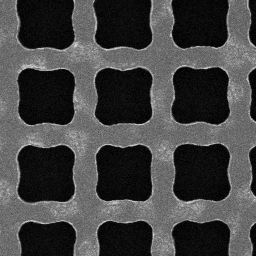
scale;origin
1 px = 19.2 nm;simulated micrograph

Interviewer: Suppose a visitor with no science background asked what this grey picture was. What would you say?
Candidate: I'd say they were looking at holes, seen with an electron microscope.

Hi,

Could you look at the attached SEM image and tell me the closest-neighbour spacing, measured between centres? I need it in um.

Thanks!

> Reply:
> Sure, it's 1.48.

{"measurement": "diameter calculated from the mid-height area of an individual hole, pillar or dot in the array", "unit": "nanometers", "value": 1190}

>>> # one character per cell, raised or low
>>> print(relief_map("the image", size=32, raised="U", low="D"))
UUDDDDDDDUUUDDDDDDDUUDDDDDDDDUUD
UUDDDDDDDUUUDDDDDDDUUUDDDDDDDUUD
UUDDDDDDDUUUDDDDDDDUUUDDDDDDUUUD
UUDDDDDDDUUUDDDDDDDUUUDDDDDDUUUD
UUDDDDDDDUUUDDDDDDDUUUDDDDDDDUUD
UUUDDDDDDUUUDDDDDDDUUUDDDDDDUUUU
UUUUUUUUUUUUUUUUUUUUUUUUUUUUUUUU
UUUUUUUUUUUUUUUUUUUUUUUUUUUUUUUU
UUUUUUUUUUUUUDUUUDUUUUUDUUUUUUUU
UUDDDDDDDUUUDDDDDDDUUUDDDDDDUUUD
UUDDDDDDDUUUDDDDDDDUUUDDDDDDDUUD
UUDDDDDDDUUUDDDDDDDUUUDDDDDDUUUD
UUDDDDDDDUUUDDDDDDDUUUDDDDDDUUUD
UUDDDDDDDUUUDDDDDDDUUDDDDDDDDUUD
UUDDDDDDDUUUDDDDDDDUUDDDDDDDDUUD
UUUDDUUDUUUUUDDDDUUUUUUUUUDDUUUU
UUUUUUUUUUUUUUUUUUUUUUUUUUUUUUUU
UUUUUUUUUUUUUUUUUUUUUUUUUUUUUUUU
UUUDDDDDDUUUUDDDDDUUUUDDDDDDUUUU
UUDDDDDDDUUUDDDDDDDUUUDDDDDDDUUD
UUDDDDDDDUUUDDDDDDDUUUDDDDDDDUUD
UUDDDDDDDUUUDDDDDDDUUUDDDDDDDUUD
UUDDDDDDDUUUDDDDDDDUUUDDDDDDDUUD
UUDDDDDDDUUUDDDDDDDUUUDDDDDDDUUD
UUDDDDDDDUUUDDDDDDDUUUDDDDDDUUUU
UUUUUUUUUUUUUUUUUUUUUUUUUUUUUUUU
UUUUUUUUUUUUUUUUUUUUUUUUUUUUUUUU
UUUUUUUUUUUUUUUUUUUUUUUUUUUUUUUU
UUDDDDDDDUUUDDDDDDDUUUDDDDDDDUUD
UUDDDDDDDDUUDDDDDDDUUDDDDDDDDUUD
UUUDDDDDDUUUDDDDDDDUUUDDDDDDDUUU
UUUDDDDDDUUUDDDDDDDUUUDDDDDDDUUU